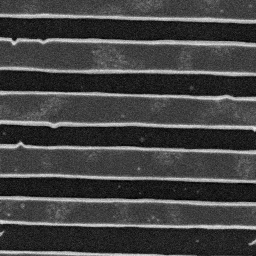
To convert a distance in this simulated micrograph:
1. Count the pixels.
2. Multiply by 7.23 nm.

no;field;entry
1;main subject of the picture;parallel lines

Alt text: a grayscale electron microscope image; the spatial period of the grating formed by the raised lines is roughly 377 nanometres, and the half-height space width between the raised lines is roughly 0.163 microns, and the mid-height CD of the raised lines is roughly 218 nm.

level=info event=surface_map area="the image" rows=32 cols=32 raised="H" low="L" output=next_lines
HHHHHHHHHHHHHHHHHHHHHHHHHHHHHHHH
HHHHHHHHHHHHHHHHHHHHHHHHHHHHHHHH
LLLLLLLLLLLLLLLLLLLLLLLLLLLLHHHH
LLLLLLLLLLLLLLLLLLLLLLLLLLLLLLLL
LLLLLLLLLLLLLLLLLLLLLLLLLLLLLLLL
HHHHHHHHHHHHHHHHHHHHHHHHHHHHHLLL
HHHHHHHHHHHHHHHHHHHHHHHHHHHHHHHH
HHHHHHHHHHHHHHHHHHHHHHHHHHHHHHHH
HLHHHHHHHHHHHHHHHHHHHHHHHHHHHHHH
LLLLLLLLLLLLLLLLLLLLLLLLLLLLLLLL
LLLLLLLLLLLLLLLLLLLLLLLLLLLLLLLL
LLLLLLLLLLLLLLLLLLLLLLLLLLLLLLLL
HHHHHHHHHHHHHHHHHHHHHHHHHHHHHHHH
HHHHHHHHHHHHHHHHHHHHHHHHHHHHHHHH
HHHHHHHHHHHHHHHHHHHHHHHHHHHHHHHH
LLLLLLHHLLHHHHHHHHHHHHHHHHHHHHHH
LLLLLLLLLLLLLLLLLLLLLLLLLLLLLLLL
LLLLLLLLLLLLLLLLLLLLLLLLLLLLLLLL
HHHHHHHHHHHHHLLLLLLLLLLLLLLLLLLL
HHHHHHHHHHHHHHHHHHHHHHHHHHHHHHHH
HHHHHHHHHHHHHHHHHHHHHHHHHHHHHHHH
HHHHHHHHHHHHHHHHHHHHHHHHHHHHHHHH
LLLLLLLLLLLLLLLLLLLLLLLLLLLHHHHH
LLLLLLLLLLLLLLLLLLLLLLLLLLLLLLLL
LLLLLLLLLLLLLLLLLLLLLLLLLLLLLLLL
HHHHHHHHHHHHHHHHHHHHHHHHHHLLHHLH
HHHHHHHHHHHHHHHHHHHHHHHHHHHHHHHH
HHHHHHHHHHHHHHHHHHHHHHHHHHHHHHHH
LLLLLLLLLLLLLLLLLLLLLLLLLLLLLLLL
LLLLLLLLLLLLLLLLLLLLLLLLLLLLLLLL
LLLLLLLLLLLLLLLLLLLLLLLLLLLLLLLL
LLLHLLLLLLLLLLLLLLLLLLLLLLLLLLLL